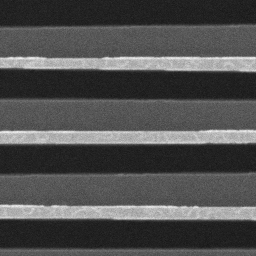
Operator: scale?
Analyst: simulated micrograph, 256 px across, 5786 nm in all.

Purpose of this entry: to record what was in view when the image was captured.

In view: lines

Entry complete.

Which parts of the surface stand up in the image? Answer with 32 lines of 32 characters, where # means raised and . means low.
................................
................................
................................
.....###########################
################################
################################
################################
################################
..##############################
................................
................................
................................
................................
################################
################################
################################
################################
################################
................................
................................
................................
................................
################################
################################
################################
################################
################################
................................
................................
................................
................................
################################